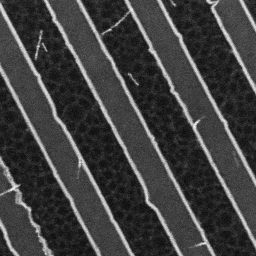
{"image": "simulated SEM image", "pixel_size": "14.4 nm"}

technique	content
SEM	one or a few lines or trenches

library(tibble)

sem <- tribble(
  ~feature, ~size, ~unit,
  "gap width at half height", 418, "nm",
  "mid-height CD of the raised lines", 614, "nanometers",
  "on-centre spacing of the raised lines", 71.9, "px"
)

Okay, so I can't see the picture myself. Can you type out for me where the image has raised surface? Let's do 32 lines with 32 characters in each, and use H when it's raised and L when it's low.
HHHHHHLLLLHHHHHHLLLLHHHHHHHLLLHH
HHHHHHLLLLLHHHHHHLLLLHHHHHHLLLLH
LHHHHHHLLLLHHHHHHLLLLHHHHHHLLLLH
LLHHHHHLLLLLHHHHHHLLLLHHHHHHLLLL
LLHHHHHHLLLLHHHHHHLLLLHHHHHHLLLL
LLLHHHHHHLLLLHHHHHHLLLLHHHHHHLLL
LLLHHHHHHLLLLHHHHHHLLLLHHHHHHLLL
LLLLHHHHHHLLLLHHHHHHLLLLHHHHHHLL
LLLLHHHHHHLLLLHHHHHHLLLLHHHHHHLL
HLLLLHHHHHHLLLLHHHHHHLLLLHHHHHHL
HLLLLHHHHHHLLLLHHHHHHLLLLHHHHHHH
HHLLLLHHHHHHLLLLHHHHHHLLLLHHHHHH
HHLLLLHHHHHHLLLLHHHHHHLLLLHHHHHH
HHHLLLLHHHHHHLLLLHHHHHHLLLLHHHHH
HHHLLLLHHHHHHLLLLHHHHHHLLLLLHHHH
HHHHLLLLHHHHHHLLLLHHHHHHLLLLHHHH
HHHHLLLLHHHHHHLLLLLHHHHHHLLLLHHH
HHHHHLLLLHHHHHHLLLLHHHHHHLLLLHHH
HHHHHLLLLHHHHHHHLLLLHHHHHHLLLLHH
HHHHHHLLLLHHHHHHLLLLHHHHHHLLLLHH
HHHHHHLLLLLHHHHHLLLLLHHHHHHLLLLH
LHHHHHHLLLLHHHHHHLLLLHHHHHHLLLLH
LHHHHHHLLLLLHHHHHHLLLLHHHHHHLLLL
LLHHHHHHLLLLHHHHHHLLLLHHHHHHLLLL
LLHHHHHHHLLLLHHHHHLLLLLHHHHHHLLL
LLLHHHHHHLLLLHHHHHHLLLLHHHHHHLLL
LLLLHHHHHHLLLLHHHHHHLLLLHHHHHHLL
LLLLHHHHHHLLLLHHHHHHLLLLHHHHHHLL
LLLLLHHHHHHLLLLHHHHHHLLLLHHHHHHL
HLLLLHHHHHHLLLLHHHHHHLLLLHHHHHHL
HLLLLLHHHHHHLLLLHHHHHHLLLLHHHHHH
HHLLLLHHHHHHLLLLHHHHHHLLLLHHHHHH